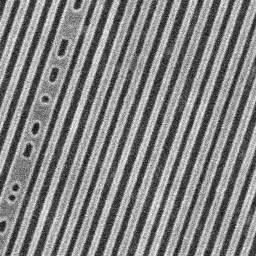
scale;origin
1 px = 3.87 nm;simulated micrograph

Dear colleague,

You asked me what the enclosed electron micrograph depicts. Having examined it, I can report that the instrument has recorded parallel lines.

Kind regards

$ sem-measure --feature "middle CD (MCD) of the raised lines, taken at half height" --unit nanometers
26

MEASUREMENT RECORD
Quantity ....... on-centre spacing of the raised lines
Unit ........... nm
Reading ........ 56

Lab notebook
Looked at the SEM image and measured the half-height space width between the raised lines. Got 29.8 nm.